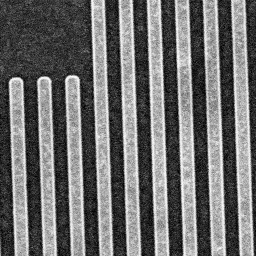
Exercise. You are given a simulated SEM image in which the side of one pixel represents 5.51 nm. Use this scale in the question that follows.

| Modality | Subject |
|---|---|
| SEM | parallel lines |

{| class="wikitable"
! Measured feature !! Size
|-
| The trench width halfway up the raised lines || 88.1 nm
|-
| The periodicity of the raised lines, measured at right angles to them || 155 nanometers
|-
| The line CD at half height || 0.0647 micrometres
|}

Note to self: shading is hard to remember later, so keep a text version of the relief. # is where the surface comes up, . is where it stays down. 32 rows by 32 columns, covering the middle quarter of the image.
........##.....##.....##.....##.
........##.....##.....##.....##.
........##.....##.....##.....##.
.##.....###....##.....##.....###
.##.....###....##.....##.....###
.##.....###....###....##.....###
.##.....###....###....##.....###
.###....###....###....###....###
.###....###....###....###....###
.###....###....###....###....###
.###....###....###....###....###
.###....###....###....###....###
.###....###....###....###....###
.###....###....###....###....###
.###....###....###....###....###
.###....###....###....###....###
.###....###....###....###....###
.###....###....###....###....###
.###....###....###....###....###
.###....###....###....###....###
.###....###....###....###....###
.###....###....###....###....###
.###....###....###....###....###
.###....###....###....###....###
.###....###....###....###....###
.###.....##....###....###.....##
.###.....##....###....###.....##
.###.....##.....##....###.....##
.###.....##.....##....###.....##
..##.....##.....##.....##.....##
..##.....##.....##.....##.....##
..##.....##.....##.....##.....##